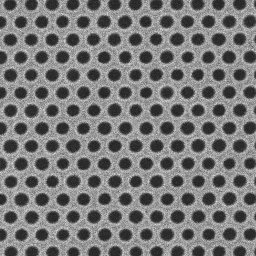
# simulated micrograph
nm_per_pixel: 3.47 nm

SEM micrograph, a regular array of holes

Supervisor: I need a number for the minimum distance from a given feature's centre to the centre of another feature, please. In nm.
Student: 70.2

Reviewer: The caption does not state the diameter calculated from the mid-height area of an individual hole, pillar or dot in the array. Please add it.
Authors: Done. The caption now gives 44.1 nanometres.